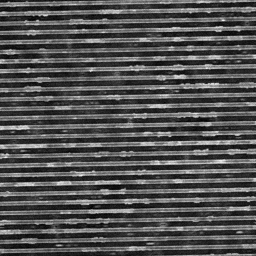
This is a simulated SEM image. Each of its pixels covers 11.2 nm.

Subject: parallel lines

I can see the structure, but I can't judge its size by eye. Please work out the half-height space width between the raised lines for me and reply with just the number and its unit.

69.8 nm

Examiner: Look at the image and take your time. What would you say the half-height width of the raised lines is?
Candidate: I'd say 0.0391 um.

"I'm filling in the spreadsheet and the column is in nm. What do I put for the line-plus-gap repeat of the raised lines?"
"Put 106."